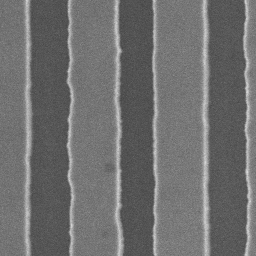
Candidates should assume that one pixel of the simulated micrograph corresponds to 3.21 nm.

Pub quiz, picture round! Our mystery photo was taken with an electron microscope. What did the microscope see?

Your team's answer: lines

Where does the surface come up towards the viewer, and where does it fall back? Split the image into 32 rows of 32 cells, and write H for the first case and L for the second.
HHHLLLLLLHHHHHHLLLLHHHHHHHLLLLLH
HHHLLLLLLHHHHHHLLLLHHHHHHHLLLLLH
HHHLLLLLLHHHHHHLLLLHHHHHHHLLLLLH
HHHLLLLLLHHHHHHLLLLHHHHHHHLLLLLH
HHHLLLLLLHHHHHHLLLLHHHHHHHLLLLLH
HHHHLLLLLHHHHHHLLLLHHHHHHHLLLLLH
HHHLLLLLLHHHHHHLLLLHHHHHHHLLLLLH
HHHHLLLLLHHHHHHLLLLHHHHHHHLLLLLH
HHHLLLLLLHHHHHHLLLLHHHHHHHLLLLLH
HHHLLLLLLHHHHHHLLLLHHHHHHHLLLLLH
HHHLLLLLLHHHHHHLLLLHHHHHHHLLLLLH
HHHLLLLLLHHHHHHLLLLHHHHHHHLLLLLH
HHHLLLLLLHHHHHHLLLLHHHHHHHLLLLLH
HHHLLLLLLHHHHHHLLLLHHHHHHHLLLLLH
HHHHLLLLLHHHHHHLLLLHHHHHHHLLLLLH
HHHLLLLLLHHHHHHLLLLHHHHHHHLLLLLH
HHHHLLLLLHHHHHHLLLLHHHHHHHLLLLLH
HHHHLLLLLHHHHHHLLLLHHHHHHHLLLLLH
HHHHLLLLLHHHHHHLLLLHHHHHHHLLLLLH
HHHLLLLLLHHHHHHLLLLHHHHHHHLLLLLH
HHHLLLLLLHHHHHHLLLLHHHHHHHLLLLLH
HHHLLLLLLHHHHHHLLLLHHHHHHHLLLLLH
HHHLLLLLLHHHHHHLLLLHHHHHHHLLLLLH
HHHLLLLLLHHHHHHLLLLHHHHHHHLLLLLH
HHHLLLLLLHHHHHHLLLLHHHHHHHLLLLLH
HHHLLLLLLHHHHHHLLLLHHHHHHHLLLLLH
HHHLLLLLLHHHHHHLLLLHHHHHHHLLLLLH
HHHLLLLLLHHHHHHLLLLHHHHHHHLLLLLH
HHHLLLLLLHHHHHHLLLLHHHHHHHLLLLLH
HHHLLLLLLHHHHHHLLLLHHHHHHHLLLLLH
HHHLLLLLLHHHHHHLLLLHHHHHHHLLLLLH
HHHLLLLLLHHHHHHLLLLHHHHHHHLLLLLH